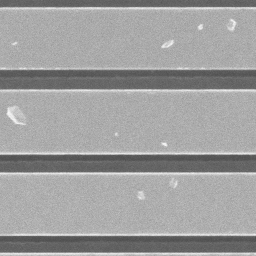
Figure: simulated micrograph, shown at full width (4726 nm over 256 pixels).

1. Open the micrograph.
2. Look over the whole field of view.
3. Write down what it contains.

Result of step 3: lines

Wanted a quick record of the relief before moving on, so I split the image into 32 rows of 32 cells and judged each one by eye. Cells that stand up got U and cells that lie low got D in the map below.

DDDDDDDDDDDDDDDDDDDDDDDDDDDDDDDD
UUUUUUUUUUUUUUUUUUUUUUUUUUUUUUUU
UUUUUUUUUUUUUUUUUUUUUUUUUUUUUUUU
UUUUUUUUUUUUUUUUUUUUUUUUUUUUUUUU
UUUUUUUUUUUUUUUUUUUUUUUUUUUUUUUU
UUUUUUUUUUUUUUUUUUUUUUUUUUUUUUUU
UUUUUUUUUUUUUUUUUUUUUUUUUUUUUUUU
UUUUUUUUUUUUUUUUUUUUUUUUUUUUUUUU
UUUUUUUUUUUUUUUUUUUUUUUUUUUUUUUU
DDDDDDDDDDDDDDDDDDDDDDDDDDDDDDDD
DDDDDDDDDDDDDDDDDDDDDDDDDDDDDDDD
UUUUUUUUUUUUUUUUUUUUUUUUUUUUUUUU
UUUUUUUUUUUUUUUUUUUUUUUUUUUUUUUU
UUUUUUUUUUUUUUUUUUUUUUUUUUUUUUUU
UUUUUUUUUUUUUUUUUUUUUUUUUUUUUUUU
UUUUUUUUUUUUUUUUUUUUUUUUUUUUUUUU
UUUUUUUUUUUUUUUUUUUUUUUUUUUUUUUU
UUUUUUUUUUUUUUUUUUUUUUUUUUUUUUUU
UUUUUUUUUUUUUUUUUUUUUUUUUUUUUUUU
DDDDDDDDDDDDDDDDDDDDDDDDDDDDDDDD
DDDDDDDDDDDDDDDDDDDDDDDDDDDDDDDD
DDDDDDDDDDDDDDDDDDDDDDDDDDDDDDDD
UUUUUUUUUUUUUUUUUUUUUUUUUUUUUUUU
UUUUUUUUUUUUUUUUUUUUUUUUUUUUUUUU
UUUUUUUUUUUUUUUUUUUUUUUUUUUUUUUU
UUUUUUUUUUUUUUUUUUUUUUUUUUUUUUUU
UUUUUUUUUUUUUUUUUUUUUUUUUUUUUUUU
UUUUUUUUUUUUUUUUUUUUUUUUUUUUUUUU
UUUUUUUUUUUUUUUUUUUUUUUUUUUUUUUU
DDDDDDDDDDDDDDDDDDDDDDDDDDDDDDDD
DDDDDDDDDDDDDDDDDDDDDDDDDDDDDDDD
DDDDDDDDDDDDDDDDDDDDDDDDDDDDDDDD